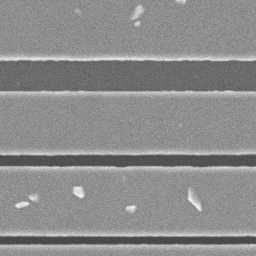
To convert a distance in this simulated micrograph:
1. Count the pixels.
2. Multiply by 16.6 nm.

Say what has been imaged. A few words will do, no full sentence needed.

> lines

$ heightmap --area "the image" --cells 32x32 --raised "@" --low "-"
@@@@@@@@@@@@@@@@@@@@@@@@@@@@@@@@
@@@@@@@@@@@@@@@@@@@@@@@@@@@@@@@@
@@@@@@@@@@@@@@@@@@@@@@@@@@@@@@@@
@@@@@@@@@@@@@@@@@@@@@@@@@@@@@@@@
@@@@@@@@@@@@@@@@@@@@@@@@@@@@@@@@
@@@@@@@@@@@@@@@@@@@@@@@@@@@@@@@@
@@@@@@@@@@@@@@@@@@@@@@@@@@@@@@@@
@@@-@@@@@@@@@--@@@-@@@@@@@@@@-@@
--------------------------------
--------------------------------
--------------------------------
---------------------------@@---
@@@@@@@@@@@@@@@@@@@@@@@@@@@@@@@@
@@@@@@@@@@@@@@@@@@@@@@@@@@@@@@@@
@@@@@@@@@@@@@@@@@@@@@@@@@@@@@@@@
@@@@@@@@@@@@@@@@@@@@@@@@@@@@@@@@
@@@@@@@@@@@@@@@@@@@@@@@@@@@@@@@@
@@@@@@@@@@@@@@@@@@@@@@@@@@@@@@@@
@@@@@@@@@@@@@@@@@@@@@@@@@@@@@@@@
--------------------------------
--------------------------------
@@@@@@@@@@@@@@@@@@@@@@@@@@@@@@@@
@@@@@@@@@@@@@@@@@@@@@@@@@@@@@@@@
@@@@@@@@@@@@@@@@@@@@@@@@@@@@@@@@
@@@@@@@@@@@@@@@@@@@@@@@@@@@@@@@@
@@@@@@@@@@@@@@@@@@@@@@@@@@@@@@@@
@@@@@@@@@@@@@@@@@@@@@@@@@@@@@@@@
@@@@@@@@@@@@@@@@@@@@@@@@@@@@@@@@
@@@@@@@@@@@@@@@@@@@@@@@@@@@@@@@@
----------------@---------------
--------------------------------
@@@@@@@@@@@@@@@@@@@@@@@@@@@@@@@@